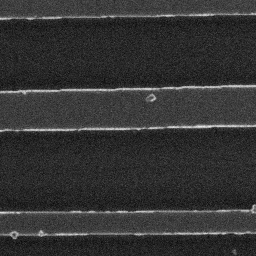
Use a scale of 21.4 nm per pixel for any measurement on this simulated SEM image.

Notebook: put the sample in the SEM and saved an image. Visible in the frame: lines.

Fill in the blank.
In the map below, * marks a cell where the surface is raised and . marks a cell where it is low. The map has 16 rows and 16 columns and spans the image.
****************
................
................
................
................
..........******
****************
****************
................
................
................
................
................
****************
****************
................